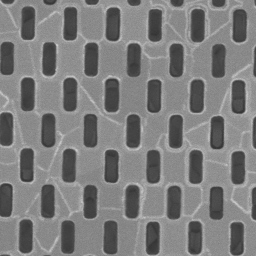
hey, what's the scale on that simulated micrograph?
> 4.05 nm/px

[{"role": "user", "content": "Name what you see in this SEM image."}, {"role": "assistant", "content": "a regular array of holes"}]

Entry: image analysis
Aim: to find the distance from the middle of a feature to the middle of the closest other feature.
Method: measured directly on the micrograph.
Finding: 165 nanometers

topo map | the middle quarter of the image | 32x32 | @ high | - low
@@@@@----@@@@@@----@@@@@@@----@@
@@@@@----@@@@@@----@@@@@@@----@@
@@@@@---@@@@@@@@---@@@@@@@----@@
@-@@@@@@@@@@@@@@@@@@@@@@@@@@@@@@
---@@@@@@@----@@@@@@@---@@@@@@@@
---@@@@@@@----@@@@@@@---@@@@@@@-
---@@@@@@@----@@@@@@@---@@@@@@@-
---@@@@@@@----@@@@@@@---@@@@@@@-
---@@@@@@@----@@@@@@@---@@@@@@@-
---@@@@@@@----@@@@@@@---@@@@@@@-
---@@@@@@@----@@@@@@@---@@@@@@@-
---@@@@@@@---@@@@@@@@---@@@@@@@@
@@@@@@-@@@@@@@@@@-@@@@@@@@@@@@@@
@@@@@---@@@@@@@@---@@@@@@@----@@
@@@@@---@@@@@@@@---@@@@@@@----@@
@@@@@---@@@@@@@@---@@@@@@@----@@
@@@@@---@@@@@@@@---@@@@@@@----@@
@@@@@---@@@@@@@----@@@@@@@----@@
@@@@@---@@@@@@@----@@@@@@@----@@
@@@@@---@@@@@@@----@@@@@@@----@@
@@@@@---@@@@@@@@---@@@@@@@---@@@
---@@@@@@@@--@@@@@@@@--@@@@@@@@@
---@@@@@@@----@@@@@@@---@@@@@@@-
---@@@@@@@----@@@@@@@---@@@@@@@-
---@@@@@@@----@@@@@@@---@@@@@@@-
---@@@@@@@----@@@@@@@---@@@@@@@-
---@@@@@@@----@@@@@@@---@@@@@@@-
---@@@@@@@----@@@@@@@---@@@@@@@-
---@@@@@@@----@@@@@@@---@@@@@@@-
--@@@@@@@@@--@@@@@@@@---@@@@@@@-
@@@@@@--@@@@@@@@--@@@@@@@@@-@@@@
@@@@@---@@@@@@@----@@@@@@@---@@@